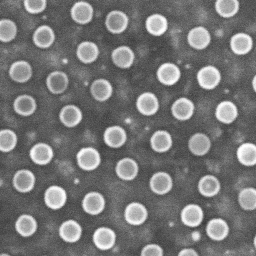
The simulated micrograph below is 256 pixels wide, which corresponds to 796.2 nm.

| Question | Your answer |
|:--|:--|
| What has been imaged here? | a regular array of raised bodies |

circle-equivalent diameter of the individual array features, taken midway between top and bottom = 21 px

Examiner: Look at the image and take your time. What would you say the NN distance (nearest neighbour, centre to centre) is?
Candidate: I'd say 111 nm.